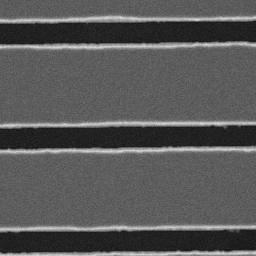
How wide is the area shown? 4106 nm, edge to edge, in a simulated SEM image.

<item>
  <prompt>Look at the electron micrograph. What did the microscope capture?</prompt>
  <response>lines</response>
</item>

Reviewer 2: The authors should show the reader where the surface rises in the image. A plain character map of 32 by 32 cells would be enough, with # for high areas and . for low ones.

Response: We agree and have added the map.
################################
################################
###########.............#.......
................................
................................
........................########
################################
################################
################################
################################
################################
################################
################################
################################
################################
############################....
................................
................................
......................###.####.#
################################
################################
################################
################################
################################
################################
################################
################################
################################
######################...##.....
................................
................................
......................#.#..#.###